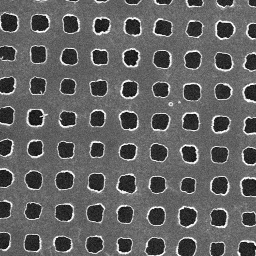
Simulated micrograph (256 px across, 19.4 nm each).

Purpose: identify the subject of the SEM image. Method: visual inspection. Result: a regular array of holes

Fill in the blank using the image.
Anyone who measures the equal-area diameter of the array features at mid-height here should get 334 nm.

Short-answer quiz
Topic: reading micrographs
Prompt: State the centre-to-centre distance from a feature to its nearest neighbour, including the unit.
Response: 591 nanometres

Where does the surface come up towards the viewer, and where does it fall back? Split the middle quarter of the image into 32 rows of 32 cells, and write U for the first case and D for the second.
UUUUUUUUUUUUUUUUUUUUUUUDDDUUUUDD
UUUUUUUUUUUUUUUUUUUUUUUUUUUUUUUU
UUUUUUUUUUUUUUUUUUUUUUUUUUUUUUUU
UUUUUUUUUUUUUUUUUUUUUUUUUUUUUUUU
DDDUUUUDDDDUUUUUDDUUUUUUDUUUUUUU
DDDUUUDDDDDUUUUDDDUUUUDDDDUUUUDD
DDDUUUUDDDDUUUUDDDUUUUDDDDUUUUDD
DDUUUUUDDDUUUUUDDDUUUUDDDDUUUUDD
UUUUUUUUUUUUUUUUUUUUUUUUUUUUUUDD
UUUUUUUUUUUUUUUUUUUUUUUUUUUUUUUU
UUUUUUUUUUUUUUUUUUUUUUUUUUUUUUUU
UUUUUUUUUUUUUUUUUUUUUUUUUUUUUUUU
DDDUUUUDDDUUUUDDDDUUUUUDDUUUUUUD
DDDUUUDDDDUUUUDDDDUUUUDDDDUUUUDD
DDDUUUDDDDUUUUDDDDUUUUDDDDUUUUDD
DUUUUUUDDDUUUUDDDDUUUUDDDDUUUUDD
UUUUUUUUUUUUUUUUUUUUUUUUDUUUUUUD
UUUUUUUUUUUUUUUUUUUUUUUUUUUUUUUU
UUUUUUUUUUUUUUUUUUUUUUUUUUUUUUUU
UUUUUUUUUUUUUUUUUUUUUUUUUUUUUUUU
DDDUUUUDDDUUUUUDDDUUUUDDDUUUUUDD
DDDUUUUDDDUUUUDDDDUUUDDDDDUUUDDD
DDDUUUUDDDUUUUDDDDUUUUDDDDUUUUDD
DUUUUUUUUUUUUUDDDUUUUUDDDDUUUUDD
UUUUUUUUUUUUUUUUUUUUUUUUUUUUUUUD
UUUUUUUUUUUUUUUUUUUUUUUUUUUUUUUU
UUUUUUUUUUUUUUUUUUUUUUUUUUUUUUUU
DDUUUUUDDDUUUUUUUUUUUUUUUUUUUUUU
DDUUUUDDDDUUUUDDDDUUUUDDDUUUUUUD
DDUUUUDDDDUUUUDDDDUUUDDDDUUUUDDD
DDUUUUDDDDUUUDDDDDUUUDDDDDUUUDDD
UUUUUUUUDUUUUUDDDDUUUUDDDUUUUDDD